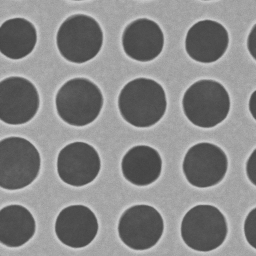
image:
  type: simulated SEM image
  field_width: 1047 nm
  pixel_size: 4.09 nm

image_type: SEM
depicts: a regular array of holes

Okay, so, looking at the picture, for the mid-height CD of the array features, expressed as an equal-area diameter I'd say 183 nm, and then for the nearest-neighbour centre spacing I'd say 254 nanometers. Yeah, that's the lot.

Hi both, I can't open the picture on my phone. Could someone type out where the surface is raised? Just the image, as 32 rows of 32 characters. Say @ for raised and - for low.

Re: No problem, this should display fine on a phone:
@@@@@@@@@@@@@@@@@@@@@@@@@@@@@@@@
@@@@@@@@@@@@@@@@@@@@@@@@@@@@@@@@
@--@@@@@----@@@@@--@@@@@@@@@@@@@
----@@@------@@@----@@@@----@@@@
-----@@------@@-----@@@-----@@@-
----@@@------@@-----@@@-----@@@-
----@@@@----@@@@----@@@-----@@@-
@@@@@@@@@--@@@@@@--@@@@@---@@@@@
@@@@@@@@@@@@@@@@@@@@@@@@@@@@@@@@
@@@@@@@@@@@@@@@@@@@@@@@@@@@@@@@@
----@@@@----@@@@----@@@@---@@@@@
-----@@------@@-----@@@-----@@@@
-----@@------@@------@@------@@-
-----@@------@@------@@------@@-
----@@@-----@@@-----@@@-----@@@@
@-@@@@@@@--@@@@@---@@@@@---@@@@@
@@@@@@@@@@@@@@@@@@@@@@@@@@@@@@@@
---@@@@@@@@@@@@@@@@@@@@@@@@@@@@@
----@@@@----@@@@@--@@@@@---@@@@@
-----@@-----@@@@----@@@-----@@@-
-----@@------@@-----@@@-----@@@-
-----@@-----@@@-----@@@-----@@@-
----@@@@----@@@@---@@@@@----@@@-
@--@@@@@@@@@@@@@@@@@@@@@@@@@@@@@
@@@@@@@@@@@@@@@@@@@@@@@@@@@@@@@@
@@@@@@@@@@@@@@@@@@@@@@@@@@@@@@@@
----@@@@----@@@@----@@@----@@@@-
----@@@-----@@@-----@@@-----@@@-
----@@@-----@@@-----@@@-----@@@-
----@@@-----@@@-----@@@-----@@@-
@--@@@@@---@@@@@---@@@@-----@@@-
@@@@@@@@@@@@@@@@@@@@@@@@@@@@@@@@